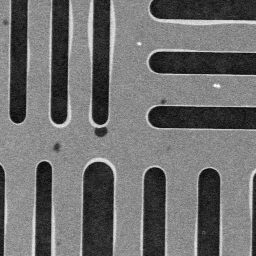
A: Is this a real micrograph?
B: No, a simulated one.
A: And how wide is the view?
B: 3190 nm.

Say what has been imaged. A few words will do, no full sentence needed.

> groups of lines, slits or small figures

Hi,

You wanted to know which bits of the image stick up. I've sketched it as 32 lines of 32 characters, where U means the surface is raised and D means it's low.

UDDDUUDDDUUUDDUUUUUDDDDDDDDDDDDD
UDDDUUDDDUUDDDUUUUUDDDDDDDDDDDDD
UDDDUUDDDUUDDDUUUUUUDDDDDDDDDDDD
UDDDUUDDDUUDDDUUUUUUUUUUUUUUUUUU
UDDDUUDDDUUDDDUUUUUUUUUUUUUUUUUU
UDDDUUDDDUUDDDUUUUUUUUUUUUUUUUUU
UDDDUUDDDUUDDDUUUUUDDDDDDDDDDDDD
UDDDUUDDDUUDDDUUUUUDDDDDDDDDDDDD
UDDUUUDDDUUUDDUUUUUDDDDDDDDDDDDD
UDDUUUDDDUUUDDUUUUUUUUUUUUUUUUUU
UDDUUUDDDUUUDDUUUUUUUUUUUUUUUUUU
UDDUUUDDDUUDDDUUUUUUUUUUUUUUUUUU
UDDUUUDDDUUDDDUUUUUUUUUUUUUUUUUU
UDDUUUDDDUUDDDUUUUUDDDDDDDDDDDDD
UDDUUUDDDUUDDDUUUUDDDDDDDDDDDDDD
UUUUUUUDUUUUDUUUUUUDDDDDDDDDDDDD
UUUUUUUUUUUUUUUUUUUUUUUUUUUUUUUU
UUUUUUUUUUUUUUUUUUUUUUUUUUUUUUUU
UUUUUUUUUUUUUUUUUUUUUUUUUUUUUUUU
UUUUUUUUUUUUUUUUUUUUUUUUUUUUUUUU
UUUUUDUUUUUDDDUUUUUUUUUUUUUUUUUU
DUUUUDDUUUUDDDUUUUDDUUUUUDDUUUUU
DUUUDDDUUUDDDDUUUUDDDUUUUDDDUUUU
DUUUDDDUUUDDDDUUUUDDDUUUUDDDUUUD
DUUUDDDUUUDDDDUUUUDDDUUUUDDDUUUD
DUUUDDDUUUDDDDUUUUDDDUUUUDDDUUUD
DUUUDDDUUUDDDDUUUUDDDUUUUDDDUUUD
DUUUDDDUUUDDDDUUUUDDDUUUUDDDUUUD
DUUUDDDUUUDDDDUUUUDDDUUUUDDDUUUD
DUUUDDDUUUDDDDUUUUDDDUUUUDDDUUUD
DUUUDDDUUUDDDDUUUUDDDUUUUDDDUUUD
DUUUDDDUUUDDDDUUUUDDDUUUUDDDUUUD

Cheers